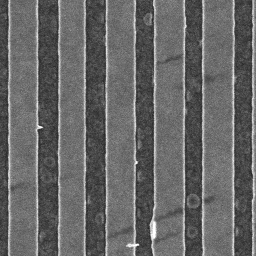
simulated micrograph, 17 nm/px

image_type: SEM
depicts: parallel lines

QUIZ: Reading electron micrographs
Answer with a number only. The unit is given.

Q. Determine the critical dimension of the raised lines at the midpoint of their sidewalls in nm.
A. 505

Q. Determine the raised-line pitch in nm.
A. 827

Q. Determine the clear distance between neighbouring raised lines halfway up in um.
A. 0.312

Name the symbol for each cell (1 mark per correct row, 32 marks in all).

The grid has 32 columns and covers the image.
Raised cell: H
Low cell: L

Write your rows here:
LHHHHLLHHHHLLHHHHLLHHHHLLHHHHLLL
LHHHHLLHHHHLLHHHHLLHHHHLLHHHHLLL
LHHHHLLHHHHLLHHHHLHHHHHLLHHHHLLL
LHHHHLLHHHHLLHHHHLLHHHHLLHHHHLLL
LHHHHLLHHHHLLHHHHLLHHHHLLHHHHLLH
LHHHHLLHHHHLLHHHHLLHHHHLLHHHHLLH
LHHHHLLHHHHLLHHHHLLHHHHLLHHHHLLL
LHHHHLLHHHHLLHHHHLLHHHHLLHHHHLLL
LHHHHLLHHHHLLHHHHLLHHHHLLHHHHLLL
LHHHHLLHHHHLLHHHHLLHHHHLLHHHHLLL
LHHHHLLHHHHLLHHHHLLHHHHLLHHHHLLL
LHHHHLLHHHHLLHHHHLLHHHHLLHHHHLLL
LHHHHLLHHHHLLHHHHLLHHHHLLHHHHLLL
LHHHHLLHHHHLLHHHHLLHHHHLLHHHHLLL
LHHHHLLHHHHLLHHHHLLHHHHLLHHHHLLL
LHHHHLLHHHHLLHHHHLLHHHHLLHHHHLLL
LHHHHLLHHHHLLHHHHLLHHHHLLHHHHLLL
LHHHHLLHHHHLLHHHHLLHHHHLLHHHHLLH
LHHHHLLHHHHLLHHHHLLHHHHLLHHHHLLH
LHHHHLLHHHHLLHHHHLLHHHHLLHHHHLLL
LHHHHLHHHHHLLHHHHLLHHHHLLHHHHLLL
LHHHHHLHHHHLLHHHHLLHHHHLLHHHHLLL
LHHHHHLHHHHLLHHHHLLHHHHLLHHHHLLL
LHHHHLLHHHHLLHHHHLLHHHHLLHHHHLLL
LHHHHLLHHHHLLHHHHLLHHHHLLHHHHLLL
LHHHHLLHHHHLLHHHHLLHHHHHHHHHHHLL
LHHHHLLHHHHLLHHHHLLHHHHLLHHHHLLL
LHHHHLLHHHHLHHHHHLLHHHHLLHHHHLLL
LHHHHLLHHHHLLHHHHLLHHHHLLHHHHLLL
LHHHHLLHHHHLLHHHHLLHHHHLLHHHHLLL
LHHHHLLHHHHLLHHHHLLHHHHLLHHHHLLL
LHHHHLLHHHHLLHHHHLLHHHHLLHHHHLLL